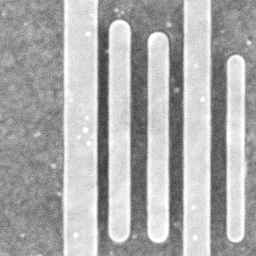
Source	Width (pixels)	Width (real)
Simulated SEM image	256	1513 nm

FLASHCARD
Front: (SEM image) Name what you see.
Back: groups of lines, slits or small figures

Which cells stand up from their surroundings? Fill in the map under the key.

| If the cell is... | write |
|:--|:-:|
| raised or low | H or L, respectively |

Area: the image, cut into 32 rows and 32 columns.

LLLLLLLLHHHHLLLLLLLLLLLHHHLLLLLL
LLLLLLLLHHHHLLLLLLLLLLLHHHLLLLLL
LLLLLLLLHHHHLLLLLLLLLLLHHHLLLLLL
LLLLLLLLHHHHLLHHLLLLLLLHHHLLLLLL
LLLLLLLLHHHHLLHHLLLHHLLHHHLLLLLL
LLLLLLLLHHHHLLHHLLLHHLLHHHLLLLLL
LLLLLLLLHHHHLLHHLLLHHLLHHHLLLLLL
LLLLLLLLHHHHLLHHLLLHHLLHHHLLLHLL
LLLLLLLLHHHHLLHHLLLHHLLHHHLLHHLL
LLLLLLLLHHHHLLHHLLLHHLLHHHLLHHLL
LLLLLLLLHHHHLLHHLLLHHLLHHHLLHHLL
LLLLLLLLHHHHLLHHLLLHHLLHHHLLLHLL
LLLLLLLLHHHHLLHHLLLHHLLHHHLLHHLL
LLLLLLLLHHHHLLHHLLLHHLLHHHLLHHLL
LLLLLLLLHHHHLLHHLLLHHLLHHHLLHHLL
LLLLLLLLHHHHLLHHLLLHHLLHHHLLHHLL
LLLLLLLLHHHHLLHHLLLHHLLHHHLLHHLL
LLLLLLLLHHHHLLHHLLLHHLLHHHLLHHLL
LLLLLLLLHHHHLLHHLLLHHLLHHHLLHHLL
LLLLLLLLHHHHLLHHLLLHHLLHHHLLHHLL
LLLLLLLLHHHHLLHHLLHHHLLHHHLLHHLL
LLLLLLLLHHHHLLHHLLHHHLLHHHLLHHLL
LLLLLLLLHHHHLLHHLLHHHLLHHHLLHHLL
LLLLLLLLHHHHLLHHLLLHHLLHHHLLHHLL
LLLLLLLLHHHHLLHHLLLHHLLHHHLLHHLL
LLLLLLLLHHHHLLHHLLLHHLLHHHLLHHLL
LLLLLLLLHHHHLLHHLLLHHLLHHHLLHHLL
LLLLLLLLHHHHLLHHLLLHHLLHHHLLHHLL
LLLLLLLLHHHHLLHHLLLHHLLHHHLLHHLL
LLLLLLLLHHHHLLHHLLLHHLLHHHLLHHLL
LLLLLLLLHHHHLLLLLLLLLLLHHHLLLLLL
LLLLLLLLHHHHLLLLLLLLLLLHHHLLLLLL